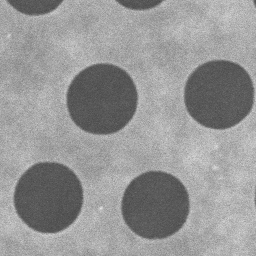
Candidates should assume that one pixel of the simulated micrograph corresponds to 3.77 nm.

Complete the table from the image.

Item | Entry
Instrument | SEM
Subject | holes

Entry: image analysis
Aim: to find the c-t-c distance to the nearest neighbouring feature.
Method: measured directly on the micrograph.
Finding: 412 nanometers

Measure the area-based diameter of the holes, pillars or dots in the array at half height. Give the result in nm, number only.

268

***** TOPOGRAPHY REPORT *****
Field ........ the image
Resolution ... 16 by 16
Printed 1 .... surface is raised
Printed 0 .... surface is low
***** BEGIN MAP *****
1001111100111111
1111111111111111
1111111111111111
1111111111111111
1111100011110001
1111000001110000
1111000001110000
1111100011110001
1111111111111111
1111111111111111
1100111111111111
1000011100011111
1000011100001111
1000011100001111
1110111100011111
1111111111111111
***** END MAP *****